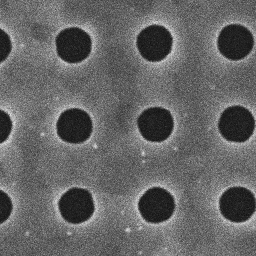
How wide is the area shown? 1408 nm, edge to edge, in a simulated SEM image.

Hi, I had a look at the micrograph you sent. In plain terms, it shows a regular array of holes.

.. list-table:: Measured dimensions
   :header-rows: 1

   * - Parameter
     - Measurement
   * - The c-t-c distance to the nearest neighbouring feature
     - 0.443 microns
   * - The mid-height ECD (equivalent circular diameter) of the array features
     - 201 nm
